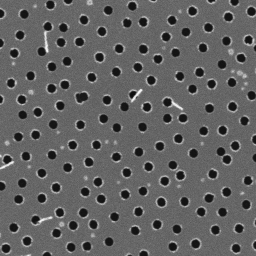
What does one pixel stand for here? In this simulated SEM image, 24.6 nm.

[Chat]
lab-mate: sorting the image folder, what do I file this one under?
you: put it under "a regular array of holes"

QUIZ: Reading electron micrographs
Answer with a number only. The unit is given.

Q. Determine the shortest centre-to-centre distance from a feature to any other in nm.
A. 458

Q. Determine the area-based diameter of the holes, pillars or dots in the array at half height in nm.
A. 221